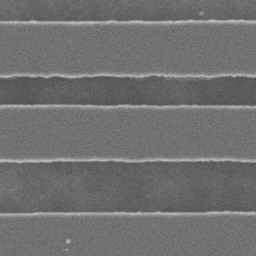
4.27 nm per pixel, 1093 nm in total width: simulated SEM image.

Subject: lines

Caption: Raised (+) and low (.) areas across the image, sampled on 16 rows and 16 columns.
................
++++++++++++++++
++++++++++++++++
++++++++++++++++
++++++++++++++++
................
................
++++++++++++++++
++++++++++++++++
++++++++++++++++
................
................
................
++++++++++++++++
++++++++++++++++
++++++++++++++++